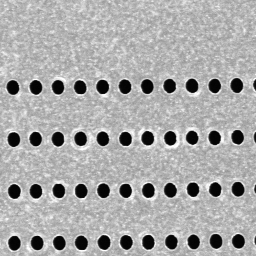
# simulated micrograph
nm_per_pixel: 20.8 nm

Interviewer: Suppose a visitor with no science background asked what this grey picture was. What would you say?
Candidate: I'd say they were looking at a regular array of holes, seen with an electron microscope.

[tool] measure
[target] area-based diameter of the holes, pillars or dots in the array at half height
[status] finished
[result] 0.288 µm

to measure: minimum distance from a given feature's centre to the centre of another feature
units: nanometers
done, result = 462